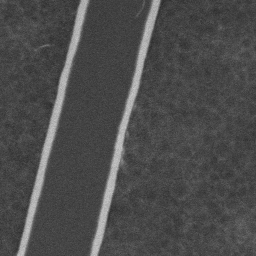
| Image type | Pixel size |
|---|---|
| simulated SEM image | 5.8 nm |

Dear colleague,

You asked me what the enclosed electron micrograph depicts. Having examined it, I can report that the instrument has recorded one or a few lines or trenches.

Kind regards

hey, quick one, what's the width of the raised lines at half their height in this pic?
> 0.407 um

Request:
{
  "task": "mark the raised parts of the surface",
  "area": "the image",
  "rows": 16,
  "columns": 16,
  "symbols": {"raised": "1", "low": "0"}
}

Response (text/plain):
0000011111000000
0000011110000000
0000011110000000
0000111110000000
0000111110000000
0000111100000000
0000111100000000
0001111100000000
0001111100000000
0001111000000000
0001111000000000
0011111000000000
0011111000000000
0011110000000000
0011110000000000
0111110000000000